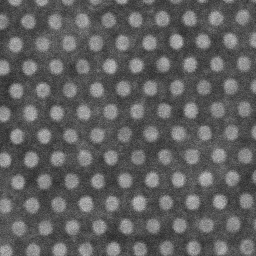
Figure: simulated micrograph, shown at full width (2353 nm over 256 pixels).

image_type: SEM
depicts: a regular array of raised bodies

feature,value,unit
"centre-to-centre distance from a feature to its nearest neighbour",242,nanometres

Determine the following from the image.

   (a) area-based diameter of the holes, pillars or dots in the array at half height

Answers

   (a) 123 nm